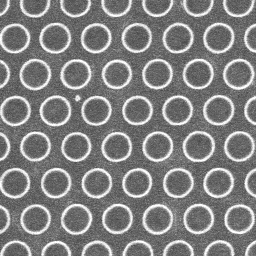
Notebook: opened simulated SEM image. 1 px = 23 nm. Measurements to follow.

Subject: a regular array of raised bodies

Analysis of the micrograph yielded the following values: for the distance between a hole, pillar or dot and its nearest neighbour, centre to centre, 0.932 microns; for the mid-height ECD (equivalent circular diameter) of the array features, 28.8 pixels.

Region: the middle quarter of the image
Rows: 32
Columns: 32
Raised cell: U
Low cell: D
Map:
UUUUUUDDDDDUUUUUDDDDDUUUUUDDDDDU
UUUUUUDDDDUUUUUUDDDDUUUUUUUDDDUU
UUUUUUDDDDUUUUUUUDDDUUUUUUUDDDUU
UUUUUUDDDDUUUUUUDDDDUUUUUUUDDDUU
UUUUUUDDDDUUUUUUDDDDUUUUUUDDDDDU
DUUUUDDDDDDUUUUDDDDDDUUUUDDDDDDD
DDDDDDDDDDDDDDDDDDDDDDDDDDDDDDDD
DDDDDDDDDDDDDDDDDDDDDDDDDDDDDDDD
DDDDDDDUUDDDDDDDDDUUDDDDDDDUUUDD
UDDDDUUUUUUDDDDDUUUUUDDDDDUUUUUD
UDDDDUUUUUUDDDDUUUUUUUDDDUUUUUUU
UDDDDUUUUUUUDDDUUUUUUUDDDUUUUUUU
UDDDDUUUUUUDDDDUUUUUUUDDDUUUUUUU
UDDDDUUUUUUDDDDUUUUUUDDDDUUUUUUD
DDDDDDUUUUDDDDDDUUUUDDDDDDUUUUDD
DDDDDDDDDDDDDDDDDDDDDDDDDDDDDDDD
DDDDDDDDDDDDDDDDDDDDDDDDDDDDDDDD
DDUUDDDDDDDDUUDDDDDDDDUUUDDDDDDD
UUUUUUDDDDDUUUUUDDDDDUUUUUDDDDDU
UUUUUUDDDDUUUUUUDDDDUUUUUUUDDDUU
UUUUUUDDDDUUUUUUUDDDUUUUUUUDDDUU
UUUUUUDDDDUUUUUUUDDDUUUUUUUDDDUU
UUUUUUDDDDUUUUUUDDDDUUUUUUDDDDUU
DUUUUDDDDDDUUUUDDDDDDUUUUDDDDDDU
DDDDDDDDDDDDDDDDDDDDDDDDDDDDDDDD
DDDDDDDDDDDDDDDDDDDDDDDDDDDDDDDD
DDDDDDDUUDDDDDDDDUUUDDDDDDDDUDDD
UDDDDDUUUUUDDDDDUUUUUDDDDDUUUUUD
UDDDDUUUUUUDDDDUUUUUUUDDDUUUUUUU
UDDDDUUUUUUUDDDUUUUUUUDDDUUUUUUU
UDDDDUUUUUUUDDDUUUUUUUDDDUUUUUUU
UDDDDUUUUUUDDDDUUUUUUDDDDUUUUUUU